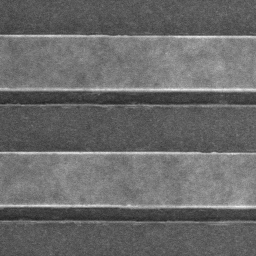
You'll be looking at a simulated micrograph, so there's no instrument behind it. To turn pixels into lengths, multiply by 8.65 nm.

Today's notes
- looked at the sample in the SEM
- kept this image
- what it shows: lines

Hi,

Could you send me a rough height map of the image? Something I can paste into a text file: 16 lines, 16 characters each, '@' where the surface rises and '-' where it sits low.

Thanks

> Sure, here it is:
----------------
----------------
@@@@@@@@@@@@@@@@
@@@@@@@@@@@@@@@@
@@@@@@@@@@@@@@@@
@@@@@@@@@@@@@@@@
----------------
----------------
----------------
----------------
@@@@@@@@@@@@@@@@
@@@@@@@@@@@@@@@@
@@@@@@@@@@@@@@@@
----------------
----------------
----------------